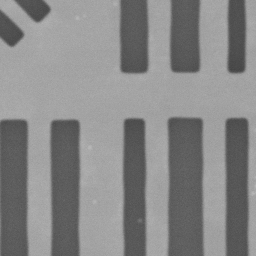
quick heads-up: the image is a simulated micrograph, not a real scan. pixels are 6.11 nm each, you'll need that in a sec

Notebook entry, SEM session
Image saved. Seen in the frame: groups of lines, slits or small figures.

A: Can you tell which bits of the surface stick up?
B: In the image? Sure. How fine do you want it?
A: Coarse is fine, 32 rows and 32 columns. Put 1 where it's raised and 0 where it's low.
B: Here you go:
11000011111111100011100001110001
11100011111111100001100001110001
01110111111111100001100001110001
00111111111111100001100001110001
00011111111111100001100001110001
10111111111111100001100001110001
11111111111111100001100001110001
11111111111111100001100001110001
11111111111111100001100001110001
11111111111111111111111111111111
11111111111111111111111111111111
11111111111111111111111111111111
11111111111111111111111111111111
11111111111111111111111111111111
11111111111111111111111111111111
00011100001111100011100001110001
00001100001111100011100001110001
00001100001111100011100001110001
00001100001111100011100001110001
00001100001111100011100001110001
00001100001111100011100001110001
00001100001111100011100001110001
00001100001111100011100001110001
00001100001111100011100001110001
00001100001111100011100001110001
00001100001111100011100001110001
00001100001111100011100001110001
00011100001111100011100001110001
00011100001111100011100001110001
00001100001111100011100001110001
00001100001111100011100001110001
00001100001111100011100001110001